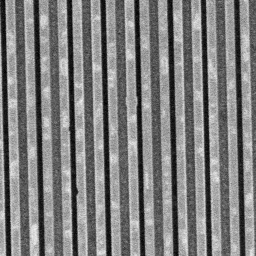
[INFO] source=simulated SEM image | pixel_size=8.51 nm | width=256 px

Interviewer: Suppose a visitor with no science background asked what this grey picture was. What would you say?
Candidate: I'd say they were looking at parallel lines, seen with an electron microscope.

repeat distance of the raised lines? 142 nanometers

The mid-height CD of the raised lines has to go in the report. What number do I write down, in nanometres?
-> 79.7